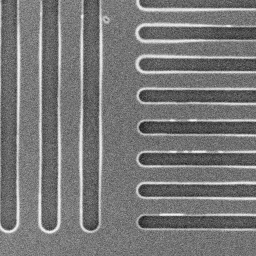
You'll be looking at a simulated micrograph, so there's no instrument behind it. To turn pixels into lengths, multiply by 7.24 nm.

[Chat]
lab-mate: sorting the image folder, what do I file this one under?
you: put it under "groups of lines, slits or small figures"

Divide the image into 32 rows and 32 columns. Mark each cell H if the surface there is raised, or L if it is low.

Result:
LLHHHLLHHHLLLHHHHLLLLLLLLLLLLLLL
LLHHHLLHHHLLLHHHHHHHHHHHHHHHHHHH
LLHHHLLHHHLLLHHHHHHHHHHHHHHHHHHH
LLHHHLLHHHLLLHHHHHLLLLLLLLLLLLLL
LLHHHLLHHHLLLHHHHLLLLLLLLLLLLLLL
LLHHHLLHHHLLLHHHHHHHHHHHHHHHHHHH
LLHHHLLHHHLLLHHHHHHHHHHHHHHHHHHH
LLHHHLLHHHLLLHHHHLLLLLLLLLLLLLLL
LLHHHLLHHHLLLHHHHLLLLLLLLLLLLLLL
LLHHHLLHHHLLLHHHHHHHHHHHHHHHHHHH
LLHHHLLHHHLLLHHHHHHHHHHHHHHHHHHH
LLHHHLLHHHLLLHHHHLLLLLLLLLLLLLLL
LLHHHLLHHHLLLHHHHHLLLLLLLLLLLLLL
LLHHHLLHHHLLLHHHHHHHHHHHHHHHHHHH
LLHHHLLHHHLLLHHHHHHHHHHHHHHHHHHH
LLHHHLLHHHLLLHHHHHLLLLLLLLLLLLLL
LLHHHLLHHHLLLHHHHHLLLLLLLLLLLLLL
LLHHHLLHHHLLLHHHHHHHHHHHHHHHHHHH
LLHHHLLHHHLLLHHHHHHHHHHHHHHHHHHH
LLHHHLLHHHLLLHHHHLLLLLLLLLLLLLLL
LLHHHLLHHHLLLHHHHHLLLLLLLLLLLLLL
LLHHHLLHHHLLHHHHHHHHHHHHHHHHHHHH
LLHHHLLHHHLLHHHHHHHHHHHHHHHHHHHH
LLHHHLLHHHLLHHHHHLLLLLLLLLLLLLLL
LLHHHLLHHHLLHHHHHHLLLLLLLLLLLLLL
LLHHHLLHHHLLHHHHHHHHHHHHHHHHHHHH
LLHHHLLHHHLLHHHHHHHHHHHHHHHHHHHH
LLHHHLLHHHLLHHHHHLLLLLLLLLLLLLLL
LLHHHLLHHHHLHHHHHHLLLLLLLLLLLLLL
HHHHHHHHHHHHHHHHHHHHHHHHHHHHHHHH
HHHHHHHHHHHHHHHHHHHHHHHHHHHHHHHH
HHHHHHHHHHHHHHHHHHHHHHHHHHHHHHHH